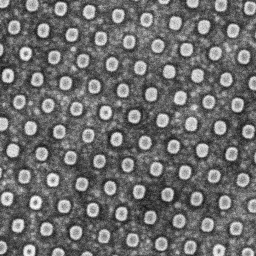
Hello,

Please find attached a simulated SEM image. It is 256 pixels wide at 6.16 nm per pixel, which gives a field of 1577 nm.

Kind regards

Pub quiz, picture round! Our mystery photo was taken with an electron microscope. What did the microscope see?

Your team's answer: a regular array of raised bodies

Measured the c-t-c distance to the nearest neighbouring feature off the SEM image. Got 174 nm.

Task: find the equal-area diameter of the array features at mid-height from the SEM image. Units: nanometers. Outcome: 74.8